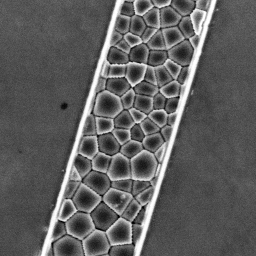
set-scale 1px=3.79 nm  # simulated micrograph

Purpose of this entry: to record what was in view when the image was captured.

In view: one or a few lines or trenches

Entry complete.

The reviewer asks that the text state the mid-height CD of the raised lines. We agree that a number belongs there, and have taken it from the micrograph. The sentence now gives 344 nanometers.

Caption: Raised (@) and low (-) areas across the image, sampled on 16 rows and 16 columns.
-------@@@@@@---
-------@@@@@@---
-------@@@@@@---
------@@@@@@----
------@@@@@@----
------@@@@@@----
------@@@@@-----
-----@@@@@@-----
-----@@@@@@-----
-----@@@@@@-----
----@@@@@@------
----@@@@@@------
----@@@@@@------
---@@@@@@-------
---@@@@@@-------
---@@@@@@-------